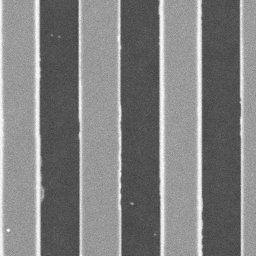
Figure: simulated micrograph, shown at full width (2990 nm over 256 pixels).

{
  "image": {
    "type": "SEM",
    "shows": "lines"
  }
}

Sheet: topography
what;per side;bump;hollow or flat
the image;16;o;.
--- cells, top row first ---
oo...oo...ooo..o
oo...oo...ooo..o
oo...ooo..ooo..o
oo...oo...ooo..o
oo...oo...ooo..o
oo...oo...ooo..o
oo...ooo..ooo..o
oo...ooo..ooo..o
oo...ooo..ooo..o
oo...ooo..ooo..o
oo...ooo..ooo..o
oo...ooo..ooo..o
oo...ooo..ooo..o
oo...ooo..ooo..o
oo...ooo..ooo..o
oo...ooo..ooo..o